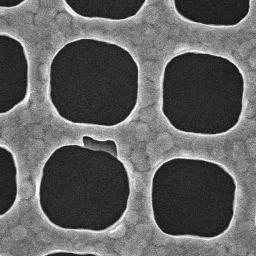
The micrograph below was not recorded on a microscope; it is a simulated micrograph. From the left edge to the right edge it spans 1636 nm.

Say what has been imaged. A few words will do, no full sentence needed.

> holes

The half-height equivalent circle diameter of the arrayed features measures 564 nm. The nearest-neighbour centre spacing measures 669 nanometres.